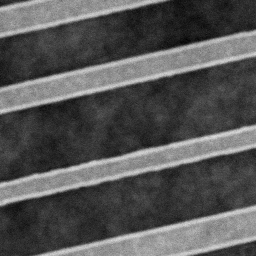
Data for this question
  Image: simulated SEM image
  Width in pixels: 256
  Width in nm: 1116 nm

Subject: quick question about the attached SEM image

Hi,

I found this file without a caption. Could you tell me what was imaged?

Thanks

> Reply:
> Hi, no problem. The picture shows one or a few lines or trenches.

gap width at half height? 266 nanometres